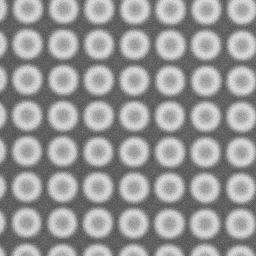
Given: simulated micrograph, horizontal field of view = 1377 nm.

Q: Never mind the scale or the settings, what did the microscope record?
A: an array of small figures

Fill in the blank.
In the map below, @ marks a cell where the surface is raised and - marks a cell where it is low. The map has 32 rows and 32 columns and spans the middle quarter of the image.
--------------------------------
@@----@@@@@----@@@@@----@@@@@---
@@@--@@@@@@@--@@@@@@@--@@@@@@@--
@@@--@@@@@@@--@@@@@@@--@@@@@@@--
@@@--@@@@@@@--@@@@@@@--@@@@@@@--
@@@--@@@@@@@--@@@@@@@--@@@@@@@--
@@----@@@@@----@@@@@----@@@@@---
@-------@-------@@@------@@@----
--------------------------------
@-------------------------------
@@----@@@@@----@@@@@----@@@@@---
@@@--@@@@@@@--@@@@@@@--@@@@@@@--
@@@--@@@@@@@--@@@@@@@--@@@@@@@--
@@@--@@@@@@@--@@@@@@@--@@@@@@@--
@@@--@@@@@@@--@@@@@@@--@@@@@@@--
@@----@@@@@----@@@@@----@@@@@---
@-------@--------@-------@@@----
--------------------------------
@-------------------------------
@@----@@@@@----@@@@@----@@@@@---
@@@--@@@@@@@--@@@@@@@--@@@@@@@--
@@@--@@@@@@@--@@@@@@@--@@@@@@@--
@@@--@@@@@@@--@@@@@@@--@@@@@@@--
@@@--@@@@@@@--@@@@@@@--@@@@@@@--
@@----@@@@@----@@@@@----@@@@@---
-----------------@-------@@@----
--------------------------------
@------@@@------@@@------@@-----
@@@---@@@@@----@@@@@----@@@@@---
@@@--@@@@@@@--@@@@@@@--@@@@@@@--
@@@--@@@@@@@--@@@@@@@--@@@@@@@--
@@@--@@@@@@@--@@@@@@@--@@@@@@@--